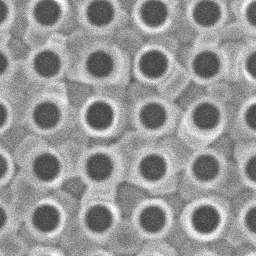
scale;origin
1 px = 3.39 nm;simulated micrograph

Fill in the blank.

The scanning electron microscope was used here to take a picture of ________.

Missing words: a regular array of holes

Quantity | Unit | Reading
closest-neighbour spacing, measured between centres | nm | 174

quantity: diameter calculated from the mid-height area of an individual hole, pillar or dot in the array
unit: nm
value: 104